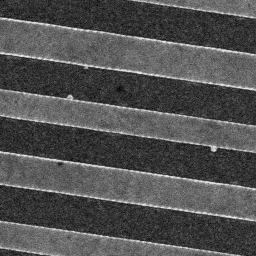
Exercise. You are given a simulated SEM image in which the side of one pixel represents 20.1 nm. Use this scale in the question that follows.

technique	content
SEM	lines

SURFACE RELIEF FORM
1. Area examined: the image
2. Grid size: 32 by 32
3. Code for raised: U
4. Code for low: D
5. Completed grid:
DDDDDDDDDDDDDDDDDDDDUUUUUUUUUUUU
DDDDDDDDDDDDDDDDDDDDDDDDDDDUUUUU
UUDDDDDDDDDDDDDDDDDDDDDDDDDDDDDD
UUUUUUUUUDDDDDDDDDDDDDDDDDDDDDDD
UUUUUUUUUUUUUUUUDDDDDDDDDDDDDDDD
UUUUUUUUUUUUUUUUUUUUUUDDDDDDDDDD
UUUUUUUUUUUUUUUUUUUUUUUUUUUUUUDD
DDDDDDUUUUUUUUUUUUUUUUUUUUUUUUUU
DDDDDDDDDDDDUUUUUUUUUUUUUUUUUUUU
DDDDDDDDDDDDDDDDDDDDUUUUUUUUUUUU
DDDDDDDDDDDDDDDDDDDDDDDDDDDUUUUU
UUDDDDDDDDDDDDDDDDDDDDDDDDDDDDDD
UUUUUUUUUDDDDDDDDDDDDDDDDDDDDDDD
UUUUUUUUUUUUUUUUDDDDDDDDDDDDDDDD
UUUUUUUUUUUUUUUUUUUUUUUDDDDDDDDD
DDDDDDDUUUUUUUUUUUUUUUUUUUUUUUDD
DDDDDDDDDDDDDDUUUUUUUUUUUUUUUUUU
DDDDDDDDDDDDDDDDDDDDDUUUUUUUUUUU
DDDDDDDDDDDDDDDDDDDDDDDDDDDDUUUU
UUUUDDDDDDDDDDDDDDDDDDDDDDDDDDDD
UUUUUUUUUUDDDDDDDDDDDDDDDDDDDDDD
UUUUUUUUUUUUUUUUUUDDDDDDDDDDDDDD
UUUUUUUUUUUUUUUUUUUUUUUUDDDDDDDD
DDDUUUUUUUUUUUUUUUUUUUUUUUUUUUUD
DDDDDDDDDDUUUUUUUUUUUUUUUUUUUUUU
DDDDDDDDDDDDDDDDDUUUUUUUUUUUUUUU
DDDDDDDDDDDDDDDDDDDDDDDDUUUUUUUU
DDDDDDDDDDDDDDDDDDDDDDDDDDDDDDDU
UUUUUUDDDDDDDDDDDDDDDDDDDDDDDDDD
UUUUUUUUUUUUUDDDDDDDDDDDDDDDDDDD
UUUUUUUUUUUUUUUUUUUUDDDDDDDDDDDD
DDDUUUUUUUUUUUUUUUUUUUUUUUUDDDDD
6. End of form